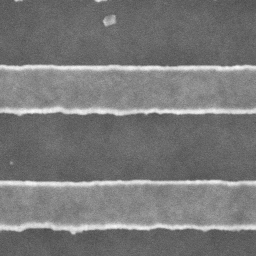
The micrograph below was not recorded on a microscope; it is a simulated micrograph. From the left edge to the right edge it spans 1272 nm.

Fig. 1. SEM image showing lines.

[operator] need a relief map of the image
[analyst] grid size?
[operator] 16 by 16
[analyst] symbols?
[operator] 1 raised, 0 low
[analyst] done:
0000000000000000
0000000000000000
0000000000000000
0000000000000000
1111111111111111
1111111111111111
1111111111111111
0000000000000000
0000000000000000
0000000000000000
0000000000000000
1111111111111111
1111111111111111
1111111111111111
0000000000000000
0000000000000000